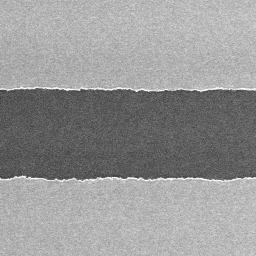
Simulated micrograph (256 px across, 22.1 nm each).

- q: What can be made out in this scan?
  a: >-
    one or a few lines or trenches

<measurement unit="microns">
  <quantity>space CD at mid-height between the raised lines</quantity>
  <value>1.97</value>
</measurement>